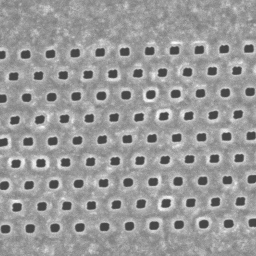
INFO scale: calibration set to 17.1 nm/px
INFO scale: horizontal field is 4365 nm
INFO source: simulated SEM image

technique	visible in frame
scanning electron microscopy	a regular array of holes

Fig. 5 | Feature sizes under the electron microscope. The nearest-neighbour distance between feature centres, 418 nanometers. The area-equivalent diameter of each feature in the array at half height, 169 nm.